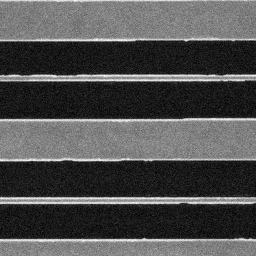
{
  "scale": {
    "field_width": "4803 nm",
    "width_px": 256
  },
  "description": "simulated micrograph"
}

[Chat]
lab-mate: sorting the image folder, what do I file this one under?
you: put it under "lines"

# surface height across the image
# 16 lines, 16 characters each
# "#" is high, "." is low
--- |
################
################
#########.......
................
................
................
................
################
################
################
................
................
................
................
................
################